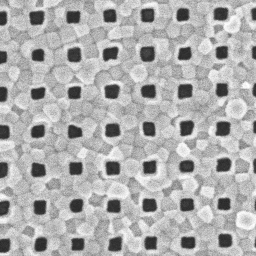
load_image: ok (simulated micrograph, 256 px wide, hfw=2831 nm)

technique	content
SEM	a regular array of holes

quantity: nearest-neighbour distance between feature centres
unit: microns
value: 0.405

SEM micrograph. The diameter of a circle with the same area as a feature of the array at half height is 162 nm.